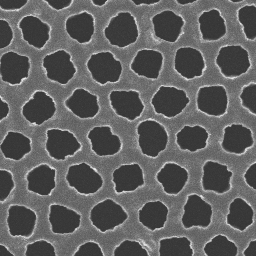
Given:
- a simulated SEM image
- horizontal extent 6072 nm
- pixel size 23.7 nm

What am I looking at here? a regular array of holes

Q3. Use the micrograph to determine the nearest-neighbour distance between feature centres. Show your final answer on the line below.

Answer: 984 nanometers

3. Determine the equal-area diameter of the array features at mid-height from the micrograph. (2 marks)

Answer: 708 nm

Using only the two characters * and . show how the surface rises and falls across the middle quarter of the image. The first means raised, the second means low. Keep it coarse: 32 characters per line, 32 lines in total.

..****........***.......****....
...***.........**.......****....
..*****.......****......*****...
..*****.......*******..********.
.********..*********************
********************************
***..*******************.....***
**.....*****......*****.......**
**......****.......***.........*
*.......****.......***.........*
*........***........**.........*
**.......****.......***.......**
***.....*****......******....***
****..**********..**************
*******************....*********
**********.********.....******.*
*******.....******.......****...
..****......*******.......**....
...***........*****.......**....
....***.......*****.......**....
....***.......*****.......***...
...****.......*****......******.
..******....********...*********
********************************
********************************
**.....*******.....******....***
*......******......*****......**
*........***........***........*
*........***........***........*
*.........**........****......**
**.......****......******.....**
***.....*****....********....***